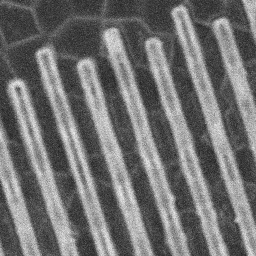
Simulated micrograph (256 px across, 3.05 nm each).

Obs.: parallel lines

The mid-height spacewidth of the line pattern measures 67.7 nm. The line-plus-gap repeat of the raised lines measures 109 nm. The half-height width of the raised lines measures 0.0397 microns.